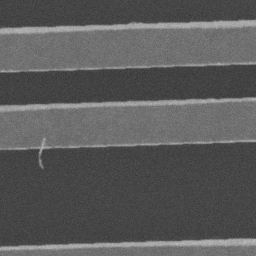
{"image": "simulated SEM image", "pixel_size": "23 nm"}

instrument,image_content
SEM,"lines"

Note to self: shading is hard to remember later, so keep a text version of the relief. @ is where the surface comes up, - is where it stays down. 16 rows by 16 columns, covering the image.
----------------
-------------@@@
@@@@@@@@@@@@@@@@
@@@@@@@@@@@@@@@@
----------------
----------------
------@@@@@@@@@@
@@@@@@@@@@@@@@@@
@@@@@@@@@@@@@@@@
----------------
----------------
----------------
----------------
----------------
----------------
@@@@@@@@@@@@@@@@